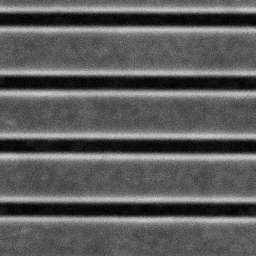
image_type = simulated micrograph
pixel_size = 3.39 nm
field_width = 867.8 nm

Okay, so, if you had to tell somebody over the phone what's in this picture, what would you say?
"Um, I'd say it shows one or a few lines or trenches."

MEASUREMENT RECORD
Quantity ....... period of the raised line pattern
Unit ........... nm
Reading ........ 215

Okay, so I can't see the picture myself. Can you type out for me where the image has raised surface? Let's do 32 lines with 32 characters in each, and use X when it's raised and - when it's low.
XXXXXXXXXXXXXXXXXXXXXXXXXXXXXXXX
--------------------------------
--------------------------------
XX--XX--------------------------
XXXXXXXXXXXXXXXXXXXXXXXXXXXXXXXX
XXXXXXXXXXXXXXXXXXXXXXXXXXXXXXXX
XXXXXXXXXXXXXXXXXXXXXXXXXXXXXXXX
XXXXXXXXXXXXXXXXXXXXXXXXXXXXXXXX
XXXXXXXXXXXXXXXXXXXXXXXXXXXXXXXX
--------------------------------
--------------------------------
XXXXXXXXXXXXXXXXX---------------
XXXXXXXXXXXXXXXXXXXXXXXXXXXXXXXX
XXXXXXXXXXXXXXXXXXXXXXXXXXXXXXXX
XXXXXXXXXXXXXXXXXXXXXXXXXXXXXXXX
XXXXXXXXXXXXXXXXXXXXXXXXXXXXXXXX
XXXXXXXXXXXXXXXXXXXXXXXXXXXXXXXX
--------------------------------
--------------------------------
XXXXXXXXXXXXXXXXXXXXXXXXXXX-----
XXXXXXXXXXXXXXXXXXXXXXXXXXXXXXXX
XXXXXXXXXXXXXXXXXXXXXXXXXXXXXXXX
XXXXXXXXXXXXXXXXXXXXXXXXXXXXXXXX
XXXXXXXXXXXXXXXXXXXXXXXXXXXXXXXX
XXXXXXXXXXXXXXXXXXXXXXXXXXXXXXXX
--------------------------------
--------------------------------
XXXXXXXXXXXXXXXXXXXXXXXXXXXXXXXX
XXXXXXXXXXXXXXXXXXXXXXXXXXXXXXXX
XXXXXXXXXXXXXXXXXXXXXXXXXXXXXXXX
XXXXXXXXXXXXXXXXXXXXXXXXXXXXXXXX
XXXXXXXXXXXXXXXXXXXXXXXXXXXXXXXX